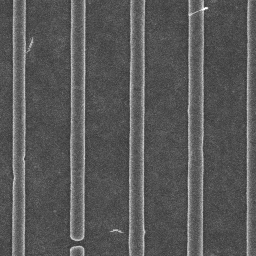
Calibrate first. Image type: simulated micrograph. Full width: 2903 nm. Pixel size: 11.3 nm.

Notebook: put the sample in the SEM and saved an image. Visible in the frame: parallel lines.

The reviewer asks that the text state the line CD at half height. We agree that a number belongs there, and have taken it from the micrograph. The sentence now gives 159 nanometres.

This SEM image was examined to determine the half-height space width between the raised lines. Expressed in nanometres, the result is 510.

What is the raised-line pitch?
668 nanometers